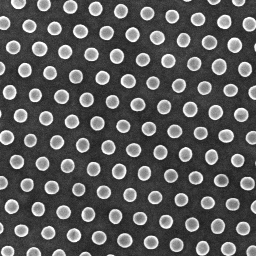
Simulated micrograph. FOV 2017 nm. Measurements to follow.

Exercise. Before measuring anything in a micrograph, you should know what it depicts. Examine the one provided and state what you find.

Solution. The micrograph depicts a regular array of raised bodies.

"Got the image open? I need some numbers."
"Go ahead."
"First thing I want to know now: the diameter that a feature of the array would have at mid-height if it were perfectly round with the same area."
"105 nm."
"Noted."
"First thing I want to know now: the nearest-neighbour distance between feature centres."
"200 nm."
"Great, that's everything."